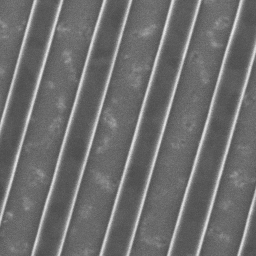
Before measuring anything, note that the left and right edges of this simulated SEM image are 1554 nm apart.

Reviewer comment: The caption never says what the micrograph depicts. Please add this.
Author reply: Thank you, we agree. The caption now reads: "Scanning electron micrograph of one or a few lines or trenches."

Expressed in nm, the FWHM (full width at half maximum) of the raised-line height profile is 157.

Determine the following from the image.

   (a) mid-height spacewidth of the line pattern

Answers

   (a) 0.244 µm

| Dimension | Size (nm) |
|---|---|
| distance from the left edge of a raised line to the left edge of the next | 402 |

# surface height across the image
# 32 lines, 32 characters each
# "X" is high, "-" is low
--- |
----XXXX-----XXX------XXX-----XX
----XXX------XXX-----XXXX-----XX
----XXX-----XXXX-----XXX------XX
---XXXX-----XXX------XXX-----XXX
---XXXX-----XXX-----XXXX-----XXX
---XXX-----XXXX-----XXX------XXX
---XXX-----XXXX-----XXX-----XXXX
--XXXX-----XXX------XXX-----XXXX
--XXX------XXX-----XXXX-----XXX-
--XXX-----XXXX-----XXX-----XXXX-
-XXXX-----XXX------XXX-----XXXX-
-XXXX-----XXX-----XXXX-----XXX--
-XXX------XXX-----XXX------XXX--
-XXX-----XXXX-----XXX-----XXXX--
XXXX-----XXX------XXX-----XXXX--
XXX------XXX-----XXXX-----XXX---
XXX-----XXXX-----XXX------XXX---
XXX-----XXX------XXX-----XXXX---
XXX-----XXX-----XXXX-----XXX----
XX-----XXXX-----XXX------XXX----
XX-----XXXX-----XXX-----XXXX----
XX-----XXX------XXX-----XXXX----
X------XXX-----XXXX-----XXX-----
X-----XXXX-----XXX-----XXXX-----
X-----XXX------XXX-----XXXX-----
X-----XXX-----XXXX-----XXXX-----
-----XXXX-----XXXX-----XXX-----X
-----XXXX-----XXX-----XXXX-----X
-----XXX------XXX-----XXXX-----X
-----XXX-----XXXX-----XXX------X
----XXXX-----XXX-----XXXX-----XX
----XXXX-----XXX-----XXXX-----XX